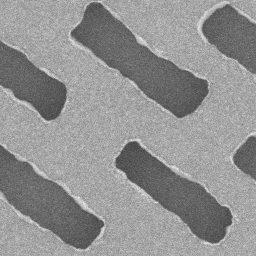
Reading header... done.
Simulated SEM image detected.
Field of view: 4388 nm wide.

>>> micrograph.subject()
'holes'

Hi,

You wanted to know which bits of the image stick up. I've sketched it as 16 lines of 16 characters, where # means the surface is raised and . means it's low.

#####..######..#
#####...#####...
#####....####...
..####....####..
...####.....####
....#####....###
##..######...###
################
################
.#######.######.
..#####....####.
....####.....###
.....#####....##
##....#####...##
###...######..##
################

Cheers